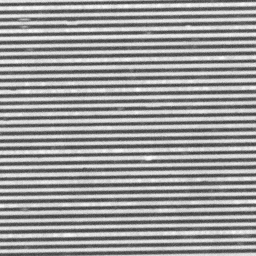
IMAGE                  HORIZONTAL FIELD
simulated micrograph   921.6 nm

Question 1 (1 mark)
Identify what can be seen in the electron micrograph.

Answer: parallel lines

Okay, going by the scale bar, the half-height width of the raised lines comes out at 9.9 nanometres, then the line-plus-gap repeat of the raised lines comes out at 27.3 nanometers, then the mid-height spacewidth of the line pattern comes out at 17.1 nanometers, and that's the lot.